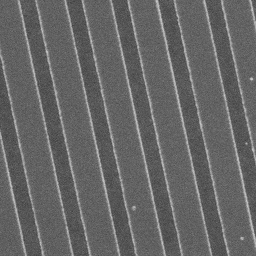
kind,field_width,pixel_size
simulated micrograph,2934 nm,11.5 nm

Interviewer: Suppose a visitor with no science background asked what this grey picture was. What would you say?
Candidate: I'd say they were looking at lines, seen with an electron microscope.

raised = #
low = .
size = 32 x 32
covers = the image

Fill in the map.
##...###..####..####..####..###.
###..####..###..####..####..####
###..####..###...###..####..####
###..####..####..###..####..####
###..####..####..####..####..###
####..###..####..####..####..###
####..####..###..####..####..###
####..####..###...###..####..###
####..####..####..####..###..###
.###..####..####..####..####..##
.####..###...###..####..####..##
.####..####..###..####..####..##
.####..####..####..###..####..##
.####..####..####..####..###..##
..###...###..####..####..####..#
..####..###...###..####..####..#
..####..####..###..####..####..#
..####..####..####..###..####..#
...###..####..####..####..####..
#..###...###..####..####..####..
#..####..####..###..####..####..
#..####..####..###..####..####..
#..####..####..####..####..###..
#...###..####..####..####..###..
##..####..###..####..####..####.
##..####..####..###..####..####.
##..####..####..####..###..####.
##..####..####..####..####..###.
###..###...###..####..####..####
###..####..###...###..####..####
###..####..####..###..####..####
###..####..####..####..###..####